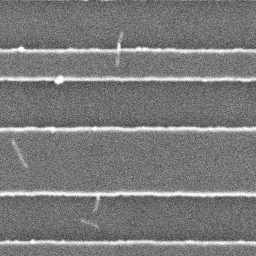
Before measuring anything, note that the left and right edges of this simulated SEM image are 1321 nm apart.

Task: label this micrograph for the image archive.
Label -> lines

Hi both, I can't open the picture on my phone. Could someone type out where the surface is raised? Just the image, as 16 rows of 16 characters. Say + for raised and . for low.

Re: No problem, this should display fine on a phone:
................
................
................
++++++++++++++++
++++++++++++++++
................
................
................
++++++++++++++++
++++++++++++++++
++++++++++++++++
++++++++++++++++
................
................
................
++++++++++++++++